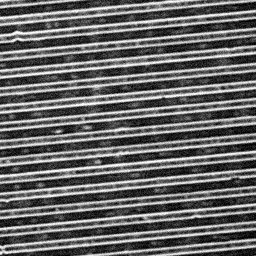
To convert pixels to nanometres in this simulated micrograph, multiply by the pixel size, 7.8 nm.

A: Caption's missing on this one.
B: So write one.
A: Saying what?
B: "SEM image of parallel lines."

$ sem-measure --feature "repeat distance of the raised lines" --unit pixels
17.5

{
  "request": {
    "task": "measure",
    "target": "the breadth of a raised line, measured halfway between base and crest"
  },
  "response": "59.2 nm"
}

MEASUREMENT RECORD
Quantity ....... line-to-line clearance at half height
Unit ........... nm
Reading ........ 80.5